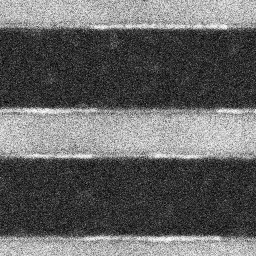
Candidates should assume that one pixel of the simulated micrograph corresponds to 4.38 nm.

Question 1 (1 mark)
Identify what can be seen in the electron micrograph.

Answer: one or a few lines or trenches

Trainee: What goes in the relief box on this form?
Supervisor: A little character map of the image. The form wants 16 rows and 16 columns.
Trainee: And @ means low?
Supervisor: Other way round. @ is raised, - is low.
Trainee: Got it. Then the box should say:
----------------
----------------
@@@@@@@@@@@@@@@@
@@@@@@@@@@@@@@@@
@@@@@@@@@@@@@@@@
@@@@@@@@@@@@@@@@
@@@@@@@@@@@@@@@@
----------------
----------------
----------------
@@@@@@@@@@@@@@@@
@@@@@@@@@@@@@@@@
@@@@@@@@@@@@@@@@
@@@@@@@@@@@@@@@@
@@@@@@@@@@@@@@@@
----------------